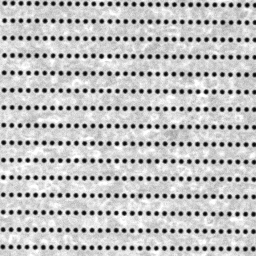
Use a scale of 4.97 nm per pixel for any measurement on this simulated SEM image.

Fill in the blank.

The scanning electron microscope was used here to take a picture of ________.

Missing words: a regular array of holes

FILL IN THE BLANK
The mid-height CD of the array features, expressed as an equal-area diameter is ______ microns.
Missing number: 0.0231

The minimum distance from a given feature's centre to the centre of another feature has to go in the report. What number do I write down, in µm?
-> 0.0398